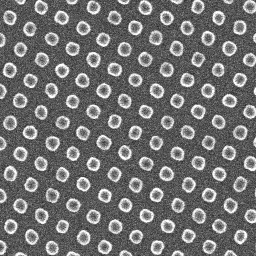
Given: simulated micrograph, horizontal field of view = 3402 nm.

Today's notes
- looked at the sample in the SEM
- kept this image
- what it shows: a regular array of raised bodies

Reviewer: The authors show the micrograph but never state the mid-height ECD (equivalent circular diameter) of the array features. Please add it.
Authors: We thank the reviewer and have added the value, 0.172 micrometres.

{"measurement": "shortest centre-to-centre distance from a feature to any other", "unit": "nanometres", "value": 304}